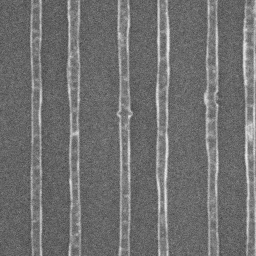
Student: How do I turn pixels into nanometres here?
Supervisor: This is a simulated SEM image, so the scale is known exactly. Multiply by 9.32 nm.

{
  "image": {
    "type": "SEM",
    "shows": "parallel lines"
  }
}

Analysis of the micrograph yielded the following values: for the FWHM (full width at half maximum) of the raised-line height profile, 0.0862 micrometres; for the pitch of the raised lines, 404 nm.